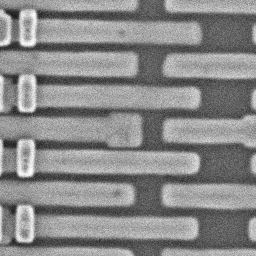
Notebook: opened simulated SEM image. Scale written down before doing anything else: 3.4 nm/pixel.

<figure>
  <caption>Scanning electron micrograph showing wiring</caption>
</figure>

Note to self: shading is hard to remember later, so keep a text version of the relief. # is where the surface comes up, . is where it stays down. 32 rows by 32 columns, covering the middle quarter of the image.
##################.......#######
##################.......#######
##################.......#######
................................
................................
.....######.....................
################################
################################
################################
################################
################################
................................
................................
...........########.............
###################.......######
###################......#######
###################......#######
###################......#######
###################......#######
...........########.............
...........#######..............
................................
################################
################################
################################
################################
################################
................................
................................
................................
#################........#######
#################........#######